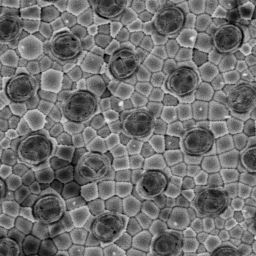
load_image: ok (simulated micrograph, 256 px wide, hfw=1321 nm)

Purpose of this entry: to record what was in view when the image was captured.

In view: a regular array of raised bodies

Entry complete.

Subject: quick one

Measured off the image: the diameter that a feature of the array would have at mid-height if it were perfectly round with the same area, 132 nanometres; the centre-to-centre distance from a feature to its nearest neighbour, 190 nanometres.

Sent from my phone